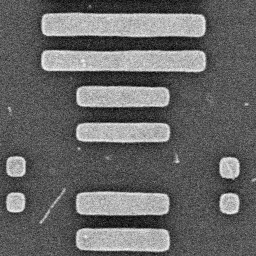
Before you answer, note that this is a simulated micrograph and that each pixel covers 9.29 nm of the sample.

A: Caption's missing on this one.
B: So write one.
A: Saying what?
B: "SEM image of wiring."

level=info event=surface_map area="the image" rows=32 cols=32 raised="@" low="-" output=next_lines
--------------------------------
--------------------------------
-----@@@@@@@@@@@@@@@@@@@@@------
-----@@@@@@@@@@@@@@@@@@@@@------
--------------------------------
--------------------------------
------@@@@@@--@@@@@@@@@@@-------
-----@@@@@@@@@@@@@@@@@@@@@------
------@@@@@@@@@@@@@@@@@@@-------
--------------------------------
--------------------------------
----------@@@@@@@@@@@-----------
----------@@@@@@@@@@@-----------
--------------------------------
--------------------------------
--------------------------------
----------@@@@@@@@@@@-----------
----------@@@@@@@@@@@-----------
--------------------------------
--------------------------------
-@@-------------------------@@--
-@@-------------------------@@--
--------------------------------
--------------------------------
-@@-------@@@@@@@@@@@-------@@--
-@@-------@@@@@@@@@@@-------@@--
----------@@@@@@@@@@@-------@---
--------------------------------
--------------------------------
----------@@@@@@@@@@@-----------
----------@@@@@@@@@@@-----------
--------------------------------